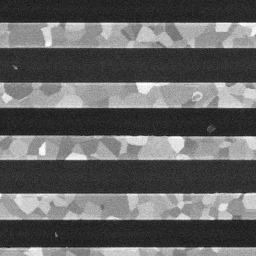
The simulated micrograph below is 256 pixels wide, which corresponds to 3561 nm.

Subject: lines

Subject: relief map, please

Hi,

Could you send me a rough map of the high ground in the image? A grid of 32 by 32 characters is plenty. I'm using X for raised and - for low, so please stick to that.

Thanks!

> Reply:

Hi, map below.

--------------------------------
--------------------------------
--------------------------------
XXXXXXXXXXXXXXXXXXXXXXXXXXXXXXXX
XXXXXXXXXXXXXXXXXXXXXXXXXXXXXXXX
XXXXXXXXXXXXXXXXXXXXXXXXXXXXXXXX
--------------------------------
--------------------------------
--------------------------------
--------------------------------
XXXXXXXXXXXXXXXXXXXXXXXXXXXXXXXX
XXXXXXXXXXXXXXXXXXXXXXXXXXXXXXXX
XXXXXXXXXXXXXXXXXXXXXXXXXXXXXXXX
--------------------------------
--------------------------------
--------------------------------
--------------------------------
XXXXXXXXXXXXXXXXXXXXXXXXXXXXXXXX
XXXXXXXXXXXXXXXXXXXXXXXXXXXXXXXX
XXXXXXXXXXXXXXXXXXXXXXXXXXXXXXXX
--------------------------------
--------------------------------
--------------------------------
--------------------------------
XXXXXXXXXXXXXXXXXXXXXXXXXXXXXXXX
XXXXXXXXXXXXXXXXXXXXXXXXXXXXXXXX
XXXXXXXXXXXXXXXXXXXXXXXXXXXXXXXX
--------------------------------
--------------------------------
--------------------------------
--------------------------------
XXXXXXXXXXXXXXXXXXXXXXXXXXXXXXXX